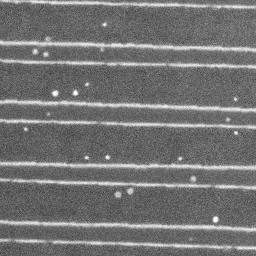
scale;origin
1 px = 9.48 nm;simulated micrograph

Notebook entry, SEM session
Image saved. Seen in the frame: lines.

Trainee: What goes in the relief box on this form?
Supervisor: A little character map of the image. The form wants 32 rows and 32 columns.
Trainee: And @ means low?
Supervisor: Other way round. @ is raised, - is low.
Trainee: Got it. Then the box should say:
-------------@@@@@@@@@@@@@@@@@@@
--------------------------------
--------------------------------
--------------------------------
--------------------------------
@@@@@@@@------------------------
@@@@@@@@@@@@@@@@@@@@@@@@@@@@@@@@
@@@@@@@@@@@@@@@@@@@@@@@@@@@@@@@@
--------------------------------
--------------------------------
--------------------------------
--------------------------------
--------------------------------
@@@@@@@@@@@@@@@@@@@@@@@@@@------
@@@@@@@@@@@@@@@@@@@@@@@@@@@@@@@@
----------------@@@@@@@@@@@@@@@@
--------------------------------
--------------------------------
--------------------------------
--------------------------------
@-------------------------------
@@@@@@@@@@@@@@@@@@@@@@@@@@@@@@@@
--@@@@@@@@@@@@@@@@@@@@@@@@@@@@@@
--------------------------------
--------------------------------
--------------------------------
--------------------------------
--------------------------------
@@@@@@@@@@@@@@@@@@@@@@@@@@@@----
@@@@@@@@@@@@@@@@@@@@@@@@@@@@@@@@
----------------@@@@@@@@@@@@@@@@
--------------------------------